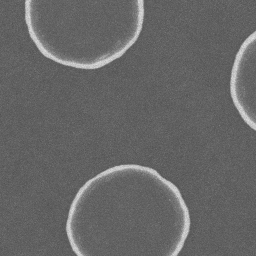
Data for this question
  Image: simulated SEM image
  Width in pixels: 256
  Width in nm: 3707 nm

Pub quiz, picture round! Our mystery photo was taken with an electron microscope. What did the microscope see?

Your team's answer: raised bodies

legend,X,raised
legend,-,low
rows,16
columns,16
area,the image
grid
--XXXXXXX-------
--XXXXXXX-------
--XXXXXX--------
---XXXX--------X
---------------X
---------------X
---------------X
---------------X
----------------
----------------
-------XX-------
-----XXXXXX-----
-----XXXXXX-----
----XXXXXXXX----
----XXXXXXXX----
-----XXXXXX-----